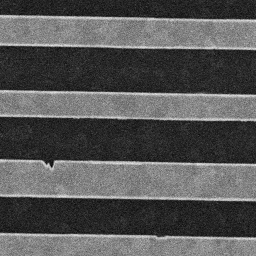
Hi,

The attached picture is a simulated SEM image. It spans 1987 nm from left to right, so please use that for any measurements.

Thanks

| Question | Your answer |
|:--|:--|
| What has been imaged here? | one or a few lines or trenches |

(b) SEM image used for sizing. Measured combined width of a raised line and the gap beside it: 572 nanometres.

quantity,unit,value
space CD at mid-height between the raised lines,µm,0.345